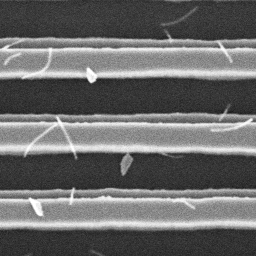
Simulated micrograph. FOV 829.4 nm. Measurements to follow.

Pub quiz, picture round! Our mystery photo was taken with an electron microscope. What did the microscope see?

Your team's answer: lines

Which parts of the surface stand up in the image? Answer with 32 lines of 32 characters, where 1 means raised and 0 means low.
00000000000000000000000000000000
00000000000000000000000000000000
00000000000000000000000000000000
00000000000000000000000000000000
00000000000000000000000000000000
11111111111111111111111111111111
11111111111111111111111111111111
11111111111111111111111111111111
11111111111111111111111111111111
11111111111111111000000000000000
00000000000000000000000000000000
00000000000000000000000000000000
00000000000000000000000000000000
00000000000000000000000000000000
11111111000110000111111111111100
11111111111111111111111111111111
11111111111111111111111111111111
11111111111111111111111111111111
11111111111111111111111111111111
00000000000000000000000000000000
00000000000000000000000000000000
00000000000000000000000000000000
00000000000000000000000000000000
00000000000000000000000000000000
11111111111111111111111111111111
11111111111111111111111111111111
11111111111111111111111111111111
11111111111111111111111111111111
00000000000000000000000000000000
00000000000000000000000000000000
00000000000000000000000000000000
00000000000000000000000000000000